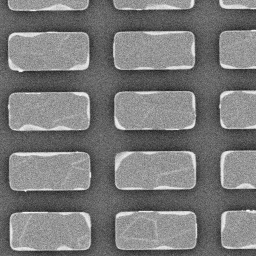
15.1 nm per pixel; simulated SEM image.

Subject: groups of lines, slits or small figures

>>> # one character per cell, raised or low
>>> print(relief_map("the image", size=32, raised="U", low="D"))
DUUUUUUUUUUDDDUUUUUUUUUUDDDDUUUU
DDDDDDDDDDDDDDDDDDDDDDDDDDDDDDDD
DDDDDDDDDDDDDDDDDDDDDDDDDDDDDDDD
DDDDDDDDDDDDDDDDDDDDDDDDDDDDDDDD
DDUUUUUUUUUDDDUUUUUUUUUUDDDDUUUU
DUUUUUUUUUUDDDUUUUUUUUUUDDDDUUUU
DUUUUUUUUUUDDDUUUUUUUUUUDDDDUUUU
DUUUUUUUUUUDDDUUUUUUUUUUDDDDUUUU
DDUUUUUUUUDDDDDUUUUUUDDDDDDDDUUD
DDDDDDDDDDDDDDDDDDDDDDDDDDDDDDDD
DDDDDDDDDDDDDDDDDDDDDDDDDDDDDDDD
DDDDDDDDDDDDDDDDDDDDDDDDDDDDDUUD
DUUUUUUUUUUDDDUUUUUUUUUUDDDDUUUU
DUUUUUUUUUUDDDUUUUUUUUUUDDDDUUUU
DUUUUUUUUUUDDDUUUUUUUUUUDDDDUUUU
DUUUUUUUUUUDDDDUUUUUUUUUDDDDUUUU
DDDDDDDDDDDDDDDDDDDDDDDDDDDDDDDD
DDDDDDDDDDDDDDDDDDDDDDDDDDDDDDDD
DDDDDDDDDDDDDDDDDDDDDDDDDDDDDDDD
DDUUUUUUUUUDDDDUUUUUUUUUDDDDUUUU
DUUUUUUUUUUDDDDUUUUUUUUUDDDDUUUU
DUUUUUUUUUUDDDUUUUUUUUUUDDDDUUUU
DUUUUUUUUUUDDDUUUUUUUUUUDDDDUUUU
DDUUUUUUUUUDDDDUUUUUDUUUDDDDUUDD
DDDDDDDDDDDDDDDDDDDDDDDDDDDDDDDD
DDDDDDDDDDDDDDDDDDDDDDDDDDDDDDDD
DDDDDDDDDDDDDDDDDDDDDDDDDDDDDUUD
DUUUUUUUUUUDDDDUUUUUUUUUDDDDUUUU
DUUUUUUUUUUDDDDUUUUUUUUUDDDDUUUU
DUUUUUUUUUUDDDDUUUUUUUUUDDDDUUUU
DUUUUUUUUUUDDDDUUUUUUUUUDDDDUUUU
DDDDDDDDDDDDDDDDDDDDDDDDDDDDDDDD